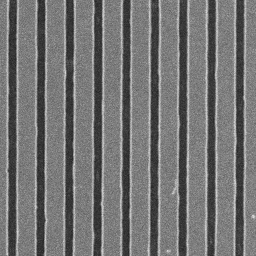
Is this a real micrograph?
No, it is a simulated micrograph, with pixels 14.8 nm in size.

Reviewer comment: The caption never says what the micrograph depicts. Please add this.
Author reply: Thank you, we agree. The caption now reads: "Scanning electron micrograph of parallel lines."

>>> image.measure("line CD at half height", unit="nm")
297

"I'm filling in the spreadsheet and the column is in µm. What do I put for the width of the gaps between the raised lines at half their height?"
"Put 0.128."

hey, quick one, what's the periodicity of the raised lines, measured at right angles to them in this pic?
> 422 nm